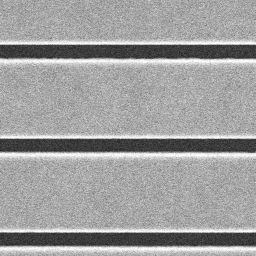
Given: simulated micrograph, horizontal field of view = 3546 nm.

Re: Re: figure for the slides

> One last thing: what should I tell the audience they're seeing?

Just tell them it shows lines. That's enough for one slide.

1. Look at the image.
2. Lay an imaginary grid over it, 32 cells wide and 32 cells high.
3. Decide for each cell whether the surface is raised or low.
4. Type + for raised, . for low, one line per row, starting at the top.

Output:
++++++++++++++++++++++++++++++++
++++++++++++++++++++++++++++++++
++++++++++++++++++++++++++++++++
++++++++++++++++++++++++++++++++
++++++++++++++++++++++++++++++++
................................
................................
++++++++++++++++++++++++++++++++
++++++++++++++++++++++++++++++++
++++++++++++++++++++++++++++++++
++++++++++++++++++++++++++++++++
++++++++++++++++++++++++++++++++
++++++++++++++++++++++++++++++++
++++++++++++++++++++++++++++++++
++++++++++++++++++++++++++++++++
++++++++++++++++++++++++++++++++
++++++++++++++++++++++++++++++++
................................
................................
++++++++++++++++++++++++++++++++
++++++++++++++++++++++++++++++++
++++++++++++++++++++++++++++++++
++++++++++++++++++++++++++++++++
++++++++++++++++++++++++++++++++
++++++++++++++++++++++++++++++++
++++++++++++++++++++++++++++++++
++++++++++++++++++++++++++++++++
++++++++++++++++++++++++++++++++
++++++++++++++++++++++++++++++++
................................
................................
++++++++++++++++++++++++++++++++